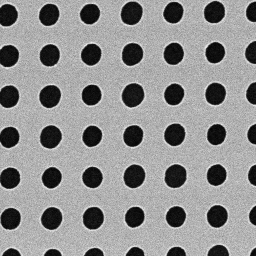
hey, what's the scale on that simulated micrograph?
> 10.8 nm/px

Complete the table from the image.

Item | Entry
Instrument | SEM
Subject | a regular array of holes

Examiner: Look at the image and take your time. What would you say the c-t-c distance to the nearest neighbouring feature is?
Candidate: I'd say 438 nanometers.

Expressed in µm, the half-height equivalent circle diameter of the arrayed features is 0.233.